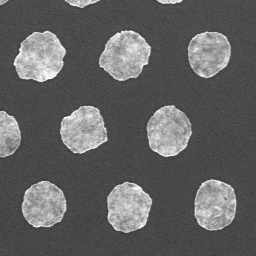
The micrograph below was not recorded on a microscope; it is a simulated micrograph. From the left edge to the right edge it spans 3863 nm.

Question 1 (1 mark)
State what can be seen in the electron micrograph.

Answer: a regular array of raised bodies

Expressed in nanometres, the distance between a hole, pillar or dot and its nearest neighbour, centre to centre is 1280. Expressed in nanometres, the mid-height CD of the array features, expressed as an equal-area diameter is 683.